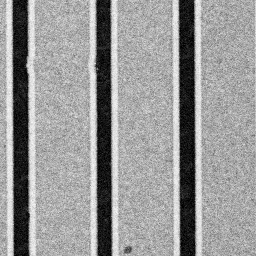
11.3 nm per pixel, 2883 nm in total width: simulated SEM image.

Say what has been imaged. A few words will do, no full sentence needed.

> one or a few lines or trenches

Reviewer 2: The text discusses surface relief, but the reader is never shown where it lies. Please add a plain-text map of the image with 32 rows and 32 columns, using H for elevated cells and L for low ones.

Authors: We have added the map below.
HLLLHHHHHHHHLLHHHHHHHHLLLHHHHHHH
HLLLHHHHHHHHLLHHHHHHHHLLLHHHHHHH
HLLLHHHHHHHHLLHHHHHHHHLLLHHHHHHH
HLLLHHHHHHHHLLHHHHHHHHLLLHHHHHHH
HLLLHHHHHHHHLLHHHHHHHHLLLHHHHHHH
HLLLHHHHHHHHLLHHHHHHHHLLLHHHHHHH
HLLLHHHHHHHHLLHHHHHHHHLLLHHHHHHH
HLLLHHHHHHHLLLHHHHHHHHLLLHHHHHHH
HLLLHHHHHHHLLLHHHHHHHHLLLHHHHHHH
HLLLHHHHHHHHLLHHHHHHHHLLLHHHHHHH
HLLLHHHHHHHHLLHHHHHHHHLLLHHHHHHH
HLLLHHHHHHHHLLHHHHHHHHLLLHHHHHHH
HLLLHHHHHHHHLLHHHHHHHHLLLHHHHHHH
HLLLHHHHHHHHLLHHHHHHHHLLLHHHHHHH
HLLLHHHHHHHHLLHHHHHHHHLLLHHHHHHH
HLLLHHHHHHHHLLHHHHHHHHLLLHHHHHHH
HLLLHHHHHHHHLLHHHHHHHHLLLHHHHHHH
HLLLHHHHHHHHLLHHHHHHHHLLLHHHHHHH
HLLLHHHHHHHHLLHHHHHHHHLLLHHHHHHH
HLLLHHHHHHHHLLHHHHHHHHLLLHHHHHHH
HLLLHHHHHHHHLLHHHHHHHHLLLHHHHHHH
HLLLHHHHHHHHLLHHHHHHHHLLLHHHHHHH
HLLLHHHHHHHHLLHHHHHHHHLLLHHHHHHH
HLLLHHHHHHHHLLHHHHHHHHLLLHHHHHHH
HLLLHHHHHHHHLLHHHHHHHHLLLHHHHHHH
HLLLHHHHHHHHLLHHHHHHHHLLLHHHHHHH
HLLLHHHHHHHHLLHHHHHHHHLLLHHHHHHH
HLLLHHHHHHHHLLHHHHHHHHLLLHHHHHHH
HLLLHHHHHHHHLLHHHHHHHHLLLHHHHHHH
HLLLHHHHHHHHLLHHHHHHHHLLLHHHHHHH
HLLLHHHHHHHHLLHHHHHHHHLLLHHHHHHH
HLLLHHHHHHHHLLHHHHHHHHLLLHHHHHHH